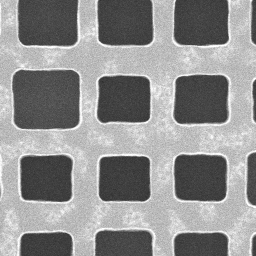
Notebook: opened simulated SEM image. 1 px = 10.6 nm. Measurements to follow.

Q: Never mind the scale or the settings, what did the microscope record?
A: holes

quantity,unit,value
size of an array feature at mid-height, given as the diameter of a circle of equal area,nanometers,577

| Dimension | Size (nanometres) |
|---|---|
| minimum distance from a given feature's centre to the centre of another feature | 810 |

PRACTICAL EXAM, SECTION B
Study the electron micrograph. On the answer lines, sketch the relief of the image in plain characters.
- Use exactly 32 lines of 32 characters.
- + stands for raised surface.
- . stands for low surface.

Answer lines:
++........++.......+++.......++.
++........++.......+++.......++.
++........++.......+++.......++.
++........++.......+++.......++.
++........++.......+++.......++.
+++......++++......+++......++++
++++++++++++++++++++++++++++++++
++++++++++++++++++++++++++++++++
++++++++++++++++++++++++++++++++
++........++++....+++++.....++++
++........++.......+++.......+++
++........++.......+++.......+++
++........++.......+++......++++
++........++.......+++.......+++
++........++.......+++.......+++
++........+++++++++++++..+.+++++
++++++++++++++++++++++++++++++++
++++++++++++++++++++++++++++++++
++++++++++++++++++++++++++++++++
+++.....++++++...+++++......+++.
++.......+++.......+++......+++.
++.......+++.......+++......+++.
+++......+++.......+++......+++.
+++......+++.......+++......+++.
+++......+++.......+++......+++.
+++++++++++++++++++++++++++++++.
++++++++++++++++++++++++++++++++
++++++++++++++++++++++++++++++++
++++++++++++++++++++++++++++++++
+++......+++.......+++......++++
+++......+++.......+++.......++.
++.......+++.......+++.......++.